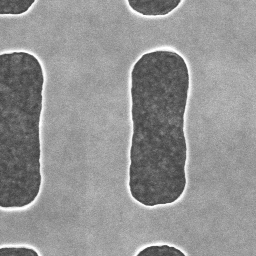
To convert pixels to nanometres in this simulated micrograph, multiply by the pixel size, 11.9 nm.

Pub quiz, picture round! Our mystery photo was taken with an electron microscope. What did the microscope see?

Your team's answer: holes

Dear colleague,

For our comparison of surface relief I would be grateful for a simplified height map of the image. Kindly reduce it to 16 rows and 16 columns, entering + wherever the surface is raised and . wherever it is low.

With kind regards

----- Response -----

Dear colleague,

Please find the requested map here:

..++++++...+++++
++++++++++++++++
++++++++++++++++
..+++++++..+++++
...+++++....++++
...+++++....++++
...+++++....++++
..++++++...+++++
..++++++....++++
...+++++....++++
...+++++....++++
...+++++....++++
..+++++++..+++++
++++++++++++++++
++++++++++++++++
..+++++++..+++++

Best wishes